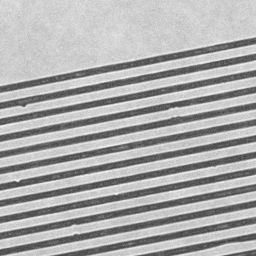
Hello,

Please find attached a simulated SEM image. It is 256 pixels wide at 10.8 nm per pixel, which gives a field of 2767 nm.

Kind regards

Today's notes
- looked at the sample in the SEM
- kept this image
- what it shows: parallel lines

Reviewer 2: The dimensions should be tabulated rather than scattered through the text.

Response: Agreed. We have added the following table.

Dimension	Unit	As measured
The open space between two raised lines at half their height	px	7.61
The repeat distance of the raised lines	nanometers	173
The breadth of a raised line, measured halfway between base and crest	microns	0.0916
